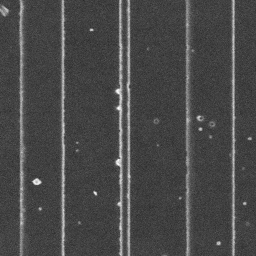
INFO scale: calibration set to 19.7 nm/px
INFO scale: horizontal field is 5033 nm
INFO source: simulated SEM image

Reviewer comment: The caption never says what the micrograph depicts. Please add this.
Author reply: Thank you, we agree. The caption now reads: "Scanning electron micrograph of lines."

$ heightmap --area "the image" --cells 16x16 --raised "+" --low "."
.+++........+++.
.+++........+++.
.+++........+++.
.+++........+++.
.+++........+++.
.+++........+++.
.+++........+++.
.+++........+++.
.+++........+++.
.+++........+++.
.+++........+++.
.+++........+++.
.+++........+++.
.+++........+++.
.+++........+++.
.+++........+++.